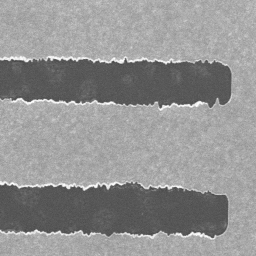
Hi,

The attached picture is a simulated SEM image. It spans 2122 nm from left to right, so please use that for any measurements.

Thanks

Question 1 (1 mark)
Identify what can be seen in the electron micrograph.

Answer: one or a few lines or trenches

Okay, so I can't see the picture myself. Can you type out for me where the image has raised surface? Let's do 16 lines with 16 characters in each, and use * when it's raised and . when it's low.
****************
****************
****************
****************
..............**
..............**
*******.....*.**
****************
****************
****************
****************
*******..*******
..............**
..............**
..*...........**
****************